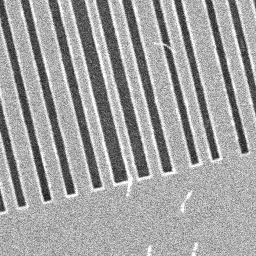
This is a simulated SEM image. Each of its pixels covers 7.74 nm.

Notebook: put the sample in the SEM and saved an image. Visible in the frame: parallel lines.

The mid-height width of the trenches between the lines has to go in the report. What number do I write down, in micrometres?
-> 0.0724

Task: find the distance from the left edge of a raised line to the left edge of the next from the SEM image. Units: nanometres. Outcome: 195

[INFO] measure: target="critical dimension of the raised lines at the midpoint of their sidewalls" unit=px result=14.3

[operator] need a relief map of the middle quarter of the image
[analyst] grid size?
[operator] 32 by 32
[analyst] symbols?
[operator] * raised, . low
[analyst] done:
..***....***...***...*****..***.
...***....**...***...*****..***.
...***....**....***...****..****
*..***....**....***...****...***
*..***....***...***...*****..***
*...***....**...***...*****..***
*...***....**....***...****...**
*...***....**....***...****...**
**..***....***...***...*****..**
**...***....**...***...*****..**
**...***....**...****..*****...*
**...***....**....***...****...*
***..***....***...***...*****..*
***...***....**...***...*****..*
***...***....**...****..*****...
***...***....**....***...****...
****..***....***...***...*****..
****...***...***...***...*****..
****...***....**....***..*****..
****...***....**....***...****..
*****..***....***...***...*****.
*****...**....***...***...*****.
.****...***....**....***..*****.
.****...***....**....***...****.
.*****..***....**....***...*****
.*****..***....***...***...*****
..****...***....**...***...*****
..****...***....**....**********
..*****..***....***.************
..*****..***...*****************
...****...**********************
...*****************************